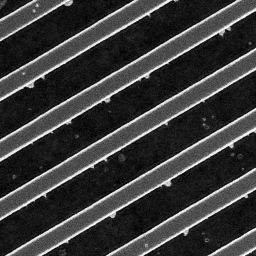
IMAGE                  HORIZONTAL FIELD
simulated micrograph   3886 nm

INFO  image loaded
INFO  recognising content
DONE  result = lines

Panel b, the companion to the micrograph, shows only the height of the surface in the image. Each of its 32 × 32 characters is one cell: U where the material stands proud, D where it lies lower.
DDDUUUUUDDDDDDDDUUUUUDDDDDDDDUUU
DDUUUUDDDDDDDDUUUUUDDDDDDDDUUUUU
UUUUDDDDDDDDDUUUUDDDDDDDDUUUUUDD
UUUDDDDDDDDUUUUUDDDDDDDDUUUUDDDD
UDDDDDDDDUUUUUDDDDDDDDUUUUDDDDDD
DDDDDDDDUUUUDDDDDDDDUUUUUDDDDDDD
DDDDDDUUUUDDDDDDDDDUUUUDDDDDDDDU
DDDDUUUUUDDDDDDDDUUUUDDDDDDDDUUU
DDDUUUUDDDDDDDDUUUUUDDDDDDDDUUUU
DUUUUDDDDDDDDUUUUUDDDDDDDDUUUUUD
UUUUDDDDDDDDUUUUDDDDDDDDUUUUUDDD
UUDDDDDDDDUUUUUDDDDDDDDUUUUDDDDD
DDDDDDDDUUUUUDDDDDDDDUUUUDDDDDDD
DDDDDDDUUUUDDDDDDDDUUUUUDDDDDDDD
DDDDDUUUUUDDDDDDDDUUUUDDDDDDDDUU
DDDUUUUUDDDDDDDDUUUUDDDDDDDDDUUU
DDUUUUDDDDDDDDUUUUUDDDDDDDDUUUUD
UUUUDDDDDDDDUUUUUDDDDDDDDUUUUUDD
UUUDDDDDDDDUUUUDDDDDDDDDUUUUDDDD
UDDDDDDDDUUUUUDDDDDDDDUUUUDDDDDD
DDDDDDDUUUUUDDDDDDDDUUUUUDDDDDDD
DDDDDDUUUUDDDDDDDDUUUUUDDDDDDDDU
DDDDUUUUUDDDDDDDDUUUUDDDDDDDDDUU
DDUUUUUDDDDDDDDUUUUDDDDDDDDDUUUU
DUUUUDDDDDDDDUUUUUDDDDDDDDUUUUUD
UUUDDDDDDDDDUUUUDDDDDDDDUUUUUDDD
UUDDDDDDDDUUUUDDDDDDDDDUUUUDDDDD
DDDDDDDDUUUUUDDDDDDDDUUUUDDDDDDD
DDDDDDDUUUUDDDDDDDDUUUUUDDDDDDDD
DDDDDUUUUDDDDDDDDDUUUUDDDDDDDDUU
DDDUUUUUDDDDDDDDUUUUDDDDDDDDDUUU
DUUUUUDDDDDDDDUUUUUDDDDDDDDUUUUD